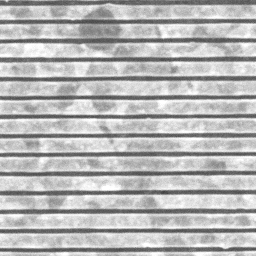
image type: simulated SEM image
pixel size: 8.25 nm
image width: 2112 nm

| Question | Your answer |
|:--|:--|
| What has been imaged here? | parallel lines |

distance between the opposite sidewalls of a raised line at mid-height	112	nanometres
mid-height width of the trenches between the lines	48.5	nanometers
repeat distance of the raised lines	157	nm